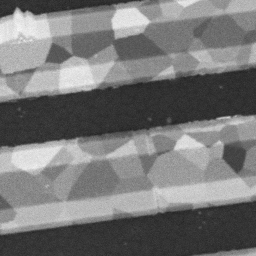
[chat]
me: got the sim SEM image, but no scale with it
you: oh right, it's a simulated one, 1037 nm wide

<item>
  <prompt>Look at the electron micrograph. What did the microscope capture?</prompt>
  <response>one or a few lines or trenches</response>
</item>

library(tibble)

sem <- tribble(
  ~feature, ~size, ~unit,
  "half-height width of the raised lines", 239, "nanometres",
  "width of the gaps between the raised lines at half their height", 290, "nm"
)